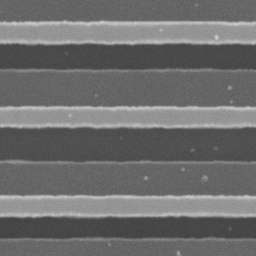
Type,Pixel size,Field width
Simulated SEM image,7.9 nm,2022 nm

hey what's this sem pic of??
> lines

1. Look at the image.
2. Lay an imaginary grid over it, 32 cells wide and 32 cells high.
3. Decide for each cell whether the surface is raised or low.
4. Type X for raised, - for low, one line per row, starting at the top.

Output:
XXXXXXXXXXXXXXXXXXXXXXXXXXXXXXXX
XXXXXXXXXXXXXXXXXXXXXXXXXXXXXXXX
XXXXXXXXXXXXXXXXXXXXXXXXXXXXXXXX
XXXXXXXXXXXXXXXXXXXXXXXXXXXXXXXX
XXXXXXXXXXXXXXXXXXXXXXXXXXXXXXXX
---XXXXX-----XXXX--XX---XXXX--XX
--------------------------------
--------------------------------
--------------------------------
XXXXXXXXXXXXXXXXXXXXXXXXXXXXXXXX
XXXXXXXXXXXXXXXXXXXXXXXXXXXXXXXX
XXXXXXXXXXXXXXXXXXXXXXXXXXXXXXXX
XXXXXXXXXXXXXXXXXXXXXXXXXXXXXXXX
XXXXXXXXXXXXXXXXXXXXXXXXXXXXXXXX
XXXXXXXXXXXXXXXXXXXXXXXXXXXXXXXX
XXXXXXXXXXXXXXXXXXXXXXXXXXXXXXXX
--------------------------------
--------------------------------
--------------------------------
--------------------------------
XXXXXXXXXXXXXXXXXXXXXXXXXXXXXXXX
XXXXXXXXXXXXXXXXXXXXXXXXXXXXXXXX
XXXXXXXXXXXXXXXXXXXXXXXXXXXXXXXX
XXXXXXXXXXXXXXXXXXXXXXXXXXXXXXXX
XXXXXXXXXXXXXXXXXXXXXXXXXXXXXXXX
XXXXXXXXXXXXXXXXXXXXXXXXXXXXXXXX
XXXXXXXXXXXXXXXXXXXXXXXXXXXXXXXX
--------------------------------
--------------------------------
--------------------------------
XXXXXXXXXXXXXXXXXXXXXXXXXXXXXXXX
XXXXXXXXXXXXXXXXXXXXXXXXXXXXXXXX